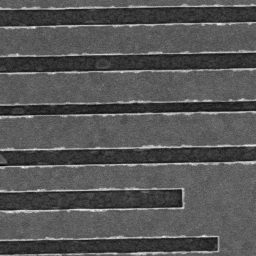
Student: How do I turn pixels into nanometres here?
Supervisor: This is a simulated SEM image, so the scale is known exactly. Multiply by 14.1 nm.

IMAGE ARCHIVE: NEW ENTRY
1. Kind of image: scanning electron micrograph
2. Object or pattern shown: parallel lines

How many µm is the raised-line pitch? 0.648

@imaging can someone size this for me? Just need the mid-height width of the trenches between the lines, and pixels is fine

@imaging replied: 16.2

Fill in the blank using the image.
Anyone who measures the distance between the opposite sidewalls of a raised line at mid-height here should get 424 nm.